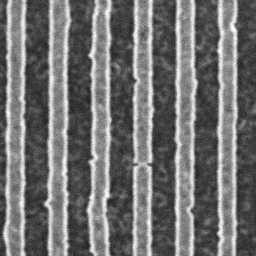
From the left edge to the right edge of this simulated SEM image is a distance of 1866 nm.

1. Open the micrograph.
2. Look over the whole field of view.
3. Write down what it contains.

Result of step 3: parallel lines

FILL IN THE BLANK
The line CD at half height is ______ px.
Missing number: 14.5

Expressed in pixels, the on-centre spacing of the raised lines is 42.4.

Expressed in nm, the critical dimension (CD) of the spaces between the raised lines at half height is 201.